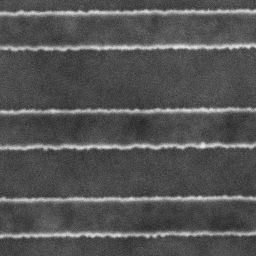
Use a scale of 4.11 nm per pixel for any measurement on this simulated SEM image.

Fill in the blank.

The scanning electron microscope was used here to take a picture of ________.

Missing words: lines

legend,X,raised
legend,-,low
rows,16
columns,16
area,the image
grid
----------------
XXXXXXXXXXXXXXXX
XXXXXXXXXXXXXXXX
----------------
----------------
----------------
----------------
XXXXXXXXXXXXXXXX
XXXXXXXXXXXXXXXX
----------------
----------------
----------------
XXXXXXXXXXXXXXXX
XXXXXXXXXXXXXXXX
XXXXXXXXXXXXXXXX
----------------